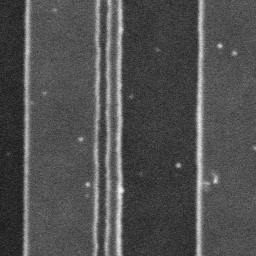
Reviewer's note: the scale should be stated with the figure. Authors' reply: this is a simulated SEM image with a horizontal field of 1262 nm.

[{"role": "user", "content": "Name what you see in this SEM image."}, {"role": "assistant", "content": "lines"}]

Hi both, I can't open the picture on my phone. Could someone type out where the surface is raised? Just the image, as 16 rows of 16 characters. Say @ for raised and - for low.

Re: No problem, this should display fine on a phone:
--@@@@@@-----@@@
--@@@@@@-----@@@
--@@@@@@-----@@@
--@@@@@------@@@
--@@@@@------@@@
--@@@@@------@@@
--@@@@@-----@@@@
--@@@@@-----@@@@
--@@@@@------@@@
--@@@@@-----@@@@
--@@@@@-----@@@@
--@@@@@@----@@@@
--@@@@@-----@@@@
--@@@@@-----@@@@
--@@@@@-----@@@@
--@@@@@-----@@@@